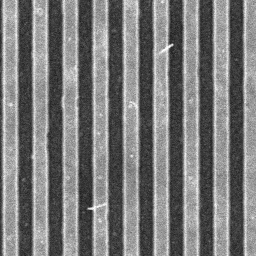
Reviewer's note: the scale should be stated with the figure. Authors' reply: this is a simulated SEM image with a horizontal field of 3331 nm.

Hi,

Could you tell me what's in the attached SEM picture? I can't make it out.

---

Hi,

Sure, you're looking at parallel lines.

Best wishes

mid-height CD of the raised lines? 0.187 um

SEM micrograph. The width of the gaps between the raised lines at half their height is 0.198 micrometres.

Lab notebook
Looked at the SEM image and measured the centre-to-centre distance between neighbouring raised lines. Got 393 nm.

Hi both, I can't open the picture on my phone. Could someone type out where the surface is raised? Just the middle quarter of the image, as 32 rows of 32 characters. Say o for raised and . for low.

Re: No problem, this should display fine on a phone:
ooo....oooo....ooo.....ooo....oo
ooo....oooo....ooo.....ooo....oo
ooo....oooo....ooo.....ooo....oo
ooo....oooo....ooo.....ooo....oo
ooo....oooo....ooo.....ooo....oo
ooo.....ooo....ooo.....ooo....oo
ooo....oooo....ooo.....ooo....oo
ooo....oooo....ooo.....ooo....oo
ooo....oooo....ooo.....ooo....oo
ooo....oooo....ooo.....ooo....oo
ooo....oooo....ooo.....ooo....oo
ooo.....ooo....ooo.....ooo....oo
ooo.....ooo....ooo.....ooo....oo
ooo.....ooo....ooo.....ooo....oo
ooo.....ooo....ooo.....ooo....oo
ooo.....ooo....ooo.....ooo....oo
ooo.....ooo....ooo.....ooo....oo
ooo.....ooo....ooo.....ooo....oo
ooo.....ooo....ooo.....ooo....oo
ooo....oooo....ooo.....ooo....oo
ooo.....ooo....ooo.....ooo....oo
ooo.....ooo....ooo.....ooo....oo
ooo.....ooo....ooo.....ooo....oo
ooo....oooo....ooo.....ooo....oo
ooo....oooo....ooo.....ooo....oo
ooo....oooo....ooo.....ooo....oo
ooo.....ooo....ooo.....ooo....oo
ooo.....ooo....ooo.....ooo....oo
ooo.....ooo....ooo.....ooo....oo
ooo.....ooo....ooo.....ooo....oo
ooo.....ooo....ooo.....ooo....oo
ooo....oooo....ooo.....ooo....oo